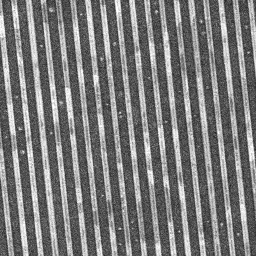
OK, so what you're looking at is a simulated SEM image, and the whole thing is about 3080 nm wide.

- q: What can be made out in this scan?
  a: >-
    parallel lines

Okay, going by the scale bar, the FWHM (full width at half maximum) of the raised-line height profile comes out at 44.8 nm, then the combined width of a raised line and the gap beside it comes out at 0.177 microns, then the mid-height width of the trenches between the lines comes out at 11.3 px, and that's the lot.